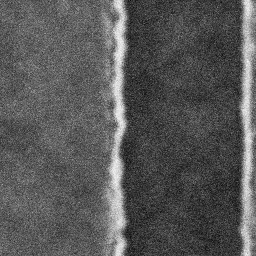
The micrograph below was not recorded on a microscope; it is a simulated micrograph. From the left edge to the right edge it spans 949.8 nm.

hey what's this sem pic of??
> one or a few lines or trenches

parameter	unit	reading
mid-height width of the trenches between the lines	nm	459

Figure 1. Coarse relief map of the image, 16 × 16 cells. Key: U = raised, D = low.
UUUUUUUUDDDDDDDU
UUUUUUUUDDDDDDDU
UUUUUUUUDDDDDDDU
UUUUUUUUDDDDDDDU
UUUUUUUUDDDDDDDU
UUUUUUUDDDDDDDDU
UUUUUUUUDDDDDDDU
UUUUUUUUDDDDDDDU
UUUUUUUUDDDDDDDU
UUUUUUUDDDDDDDDU
UUUUUUUDDDDDDDDU
UUUUUUUDDDDDDDDU
UUUUUUUDDDDDDDDU
UUUUUUUUDDDDDDDU
UUUUUUUUDDDDDDDU
UUUUUUUUDDDDDDDU